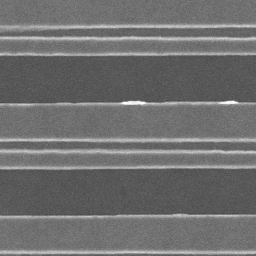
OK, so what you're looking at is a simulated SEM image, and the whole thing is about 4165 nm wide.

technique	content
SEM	lines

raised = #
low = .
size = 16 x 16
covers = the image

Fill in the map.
################
################
################
................
................
................
......##########
################
################
################
................
................
................
..........######
################
################